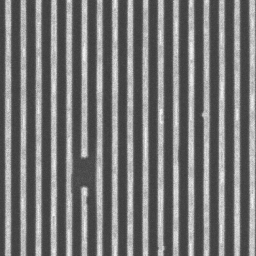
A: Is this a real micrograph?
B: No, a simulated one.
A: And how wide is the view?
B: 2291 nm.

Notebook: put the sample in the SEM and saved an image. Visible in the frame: parallel lines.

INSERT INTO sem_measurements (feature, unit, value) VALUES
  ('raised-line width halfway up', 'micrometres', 0.0616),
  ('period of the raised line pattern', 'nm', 137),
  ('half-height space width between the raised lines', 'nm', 78.3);